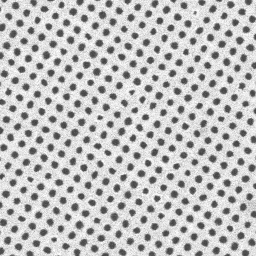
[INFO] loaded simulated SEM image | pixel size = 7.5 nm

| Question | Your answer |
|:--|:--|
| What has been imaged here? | a regular array of holes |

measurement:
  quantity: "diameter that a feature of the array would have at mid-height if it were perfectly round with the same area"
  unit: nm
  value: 54.2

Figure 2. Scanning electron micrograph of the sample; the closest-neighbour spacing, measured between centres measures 0.0931 µm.